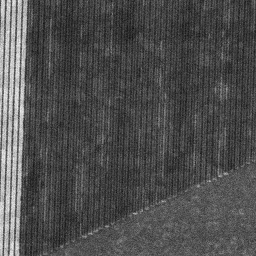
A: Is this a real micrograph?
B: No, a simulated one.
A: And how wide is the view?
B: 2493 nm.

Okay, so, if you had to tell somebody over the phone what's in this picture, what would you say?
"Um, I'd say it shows parallel lines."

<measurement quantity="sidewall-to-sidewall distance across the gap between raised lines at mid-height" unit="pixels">2.37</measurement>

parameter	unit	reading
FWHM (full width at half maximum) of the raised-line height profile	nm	31.6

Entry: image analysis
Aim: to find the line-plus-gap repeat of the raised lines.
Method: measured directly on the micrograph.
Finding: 54.1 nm